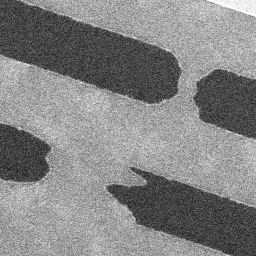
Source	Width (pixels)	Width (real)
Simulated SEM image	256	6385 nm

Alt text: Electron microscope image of one or a few lines or trenches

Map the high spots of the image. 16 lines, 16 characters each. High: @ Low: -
@@@-----------@@
@@@@@@----------
@@@@@@@@@-------
@@@@@@@@@@@-----
@--@@@@@@@@--@@-
------@@@@@-@@@@
---------@--@@@@
-------------@@@
@@-------------@
@@@-------------
@@@-------------
--@------@@@----
-------@@@@@@@@-
--------@@@@@@@@
----------@@@@@@
-------------@@@